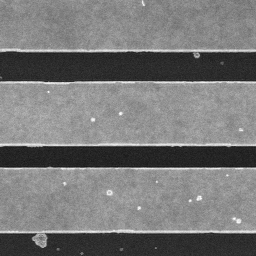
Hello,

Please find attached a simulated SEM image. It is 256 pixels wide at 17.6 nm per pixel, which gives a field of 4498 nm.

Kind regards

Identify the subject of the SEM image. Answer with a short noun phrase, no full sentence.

lines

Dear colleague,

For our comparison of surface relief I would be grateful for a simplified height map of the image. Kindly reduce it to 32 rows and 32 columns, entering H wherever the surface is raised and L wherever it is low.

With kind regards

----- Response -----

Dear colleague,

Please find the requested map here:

HHHHHHHHHHHHHHHHHHHHHHHHHHHHHHHH
HHHHHHHHHHHHHHHHHHHHHHHHHHHHHHHH
HHHHHHHHHHHHHHHHHHHHHHHHHHHHHHHH
HHHHHHHHHHHHHHHHHHHHHHHHHHHHHHHH
HHHHHHHHHHHHHHHHHHHHHHHHHHHHHHHH
HHHHHHHHHHHHHHHHHHHHHHHHHHHHHHHH
LLLLLLLLLLLLLLLLLLLLLLLLLLLLLLLL
LLLLLLLLLLLLLLLLLLLLLLLLLLLLLLLL
LLLLLLLLLLLLLLLLLLLLLLLLLLLLLLLL
LLLLLLLLLLLLLLLLLLLLLLLLLLLLLLLL
HHHHHHHHHHHHHHHHHHHHHHHHHHHHHHHH
HHHHHHHHHHHHHHHHHHHHHHHHHHHHHHHH
HHHHHHHHHHHHHHHHHHHHHHHHHHHHHHHH
HHHHHHHHHHHHHHHHHHHHHHHHHHHHHHHH
HHHHHHHHHHHHHHHHHHHHHHHHHHHHHHHH
HHHHHHHHHHHHHHHHHHHHHHHHHHHHHHHH
HHHHHHHHHHHHHHHHHHHHHHHHHHHHHHHH
HHHHHHHHHHHHHHHHHHHHHHHHHHHHHHHH
LLLLLLLLLLLLLLLLLLLLLLLLLLLLLLLL
LLLLLLLLLLLLLLLLLLLLLLLLLLLLLLLL
LLLLLLLLLLLLLLLLLLLLLLLLLLLLLLLL
HHHHHHHHHHHHHHHHHHHHHHHHHHHHHHHH
HHHHHHHHHHHHHHHHHHHHHHHHHHHHHHHH
HHHHHHHHHHHHHHHHHHHHHHHHHHHHHHHH
HHHHHHHHHHHHHHHHHHHHHHHHHHHHHHHH
HHHHHHHHHHHHHHHHHHHHHHHHHHHHHHHH
HHHHHHHHHHHHHHHHHHHHHHHHHHHHHHHH
HHHHHHHHHHHHHHHHHHHHHHHHHHHHHHHH
HHHHHHHHHHHHHHHHHHHHHHHHHHHHHHHH
LLLLLLLLLLLLLLLLLLLLLLLLLLLLLLLL
LLLLLLLLLLLLLLLLLLLLLLLLLLLLLLLL
LLLLLLLLLLLLLLLLLLLLLLLLLLLLLLLL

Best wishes